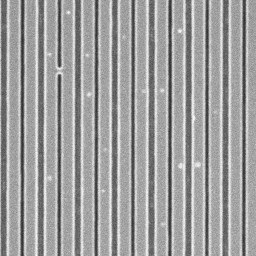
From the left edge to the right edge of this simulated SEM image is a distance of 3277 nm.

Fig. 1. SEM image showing parallel lines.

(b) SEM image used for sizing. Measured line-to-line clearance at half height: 56 nanometres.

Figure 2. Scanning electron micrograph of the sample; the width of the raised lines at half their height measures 168 nm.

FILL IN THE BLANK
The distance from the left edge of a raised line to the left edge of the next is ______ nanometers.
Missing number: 236